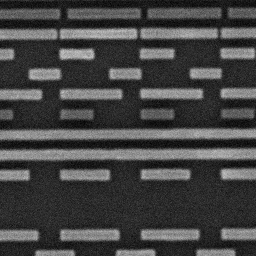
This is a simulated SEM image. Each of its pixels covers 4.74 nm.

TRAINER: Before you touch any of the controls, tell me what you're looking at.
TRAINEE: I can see wiring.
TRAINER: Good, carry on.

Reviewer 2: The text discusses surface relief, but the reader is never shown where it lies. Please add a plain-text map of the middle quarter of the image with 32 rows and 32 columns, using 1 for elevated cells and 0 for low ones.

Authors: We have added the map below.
00000000000000000000000000000000
00000000000011111110000000000000
00000000000011111110000000000000
00000000000011111110000000000000
00000000000000000000000000000000
00000000000000000000000000000000
00000000000000000000000000000000
11111111111111000001111111111111
11111111111111000001111111111111
00000000000000000000000000000000
00000000000000000000000000000000
00000000000000000001111111100000
11111110000000000001111111100000
11111110000000000000111111100000
00000000000000000000000000000000
00000000000000000000000000000000
00000000000000000000000000011111
11111111111111111111111111111111
11111111111111111111111111111111
00000000000000000000000000000000
00000000000000000000000000000000
00000000000000000000000000000000
11111111111111111111111111111111
11111111111111111111111111111111
00000000000000000000000000000000
00000000000000000000000000000000
00000000000000000000000111111100
11111111111000000001111111111110
11111111111000000001111111111110
00000000000000000000000000000000
00000000000000000000000000000000
00000000000000000000000000000000